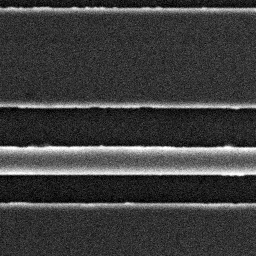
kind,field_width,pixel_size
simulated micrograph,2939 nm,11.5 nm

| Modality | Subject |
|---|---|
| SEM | lines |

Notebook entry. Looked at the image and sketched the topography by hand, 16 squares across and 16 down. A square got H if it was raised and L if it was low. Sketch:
HHHHHHHLLHLLHLLL
HHHHHHHHHHHHHHHH
HHHHHHHHHHHHHHHH
HHHHHHHHHHHHHHHH
HHHHHHHHHHHHHHHH
HHHHHHHHHHHHHHHH
HHHHHHHHHHHHHHHH
LLLLLLLLLLLLLLLL
LLLLLLLLLLLLLLLL
HHHHHHHHHHHHHHHH
HHHHHHHHHHHHHHHH
LLLLLLLLLLLLLLLL
LLLLLLLLLLLLLLLL
HHHHHHHHHHHHHHHH
HHHHHHHHHHHHHHHH
HHHHHHHHHHHHHHHH